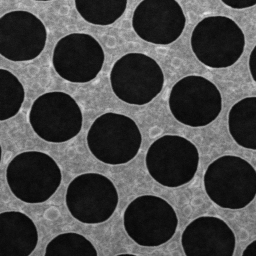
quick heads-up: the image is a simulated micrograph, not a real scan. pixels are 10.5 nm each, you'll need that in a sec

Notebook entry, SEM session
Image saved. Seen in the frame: a regular array of holes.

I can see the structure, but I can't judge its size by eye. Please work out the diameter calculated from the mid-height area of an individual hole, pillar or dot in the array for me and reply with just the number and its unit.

52.4 pixels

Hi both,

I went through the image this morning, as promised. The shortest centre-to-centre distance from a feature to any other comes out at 0.653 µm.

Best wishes